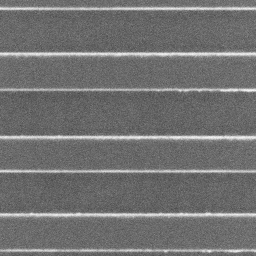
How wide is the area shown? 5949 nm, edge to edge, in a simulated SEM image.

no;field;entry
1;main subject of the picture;lines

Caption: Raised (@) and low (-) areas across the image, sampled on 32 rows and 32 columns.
@@@@@@@@@@@@@@@@@@@@@@@@@@@@@@@@
--------------------------------
--------------------------------
--------------------------------
--------------------------------
--------------------------------
--------------------------------
@@@@@@@@@@@@@@@@@@@@@@@@@@@@@@@@
@@@@@@@@@@@@@@@@@@@@@@@@@@@@@@@@
@@@@@@@@@@@@@@@@@@@@@@@@@@@@@@@@
@@@@@@@@@@@@@@@@@@@@@@@@@@@@@@@@
--------------------------------
--------------------------------
--------------------------------
--------------------------------
--------------------------------
--------------------------------
@@@@@@@@@@@@@@@@@@@@@@@@@@@@@@@@
@@@@@@@@@@@@@@@@@@@@@@@@@@@@@@@@
@@@@@@@@@@@@@@@@@@@@@@@@@@@@@@@@
@@@@@@@@@@@@@@@@@@@@@@@@@@@@@@@@
--------------------------------
--------------------------------
--------------------------------
--------------------------------
--------------------------------
--------------------------------
@@@@@@@@@@@@@@@@@@@@@@@@@@@@@@@@
@@@@@@@@@@@@@@@@@@@@@@@@@@@@@@@@
@@@@@@@@@@@@@@@@@@@@@@@@@@@@@@@@
@@@@@@@@@@@@@@@@@@@@@@@@@@@@@@@@
--------------------------------